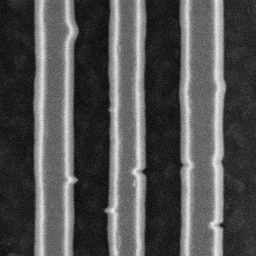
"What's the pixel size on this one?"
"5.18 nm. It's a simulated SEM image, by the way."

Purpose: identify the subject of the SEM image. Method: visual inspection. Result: one or a few lines or trenches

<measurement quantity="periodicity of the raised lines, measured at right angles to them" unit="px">73.8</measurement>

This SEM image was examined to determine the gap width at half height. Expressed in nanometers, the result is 229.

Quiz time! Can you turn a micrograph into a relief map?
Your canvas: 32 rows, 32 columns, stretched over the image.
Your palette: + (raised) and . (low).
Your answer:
.....++++.....++++.....++++.....
.....++++.....++++.....++++.....
.....++++.....++++.....++++.....
.....++++.....++++.....++++.....
.....++++.....++++.....++++.....
.....++++.....++++.....++++.....
.....++++.....++++.....++++.....
.....++++.....++++.....++++.....
.....++++.....++++.....++++.....
.....++++.....++++.....++++.....
.....++++.....+++......+++++....
.....++++.....++++.....+++++....
.....++++.....++++.....++++.....
.....++++.....++++.....++++.....
.....++++.....++++.....++++.....
.....++++.....++++.....++++.....
.....++++.....++++.....++++.....
.....++++.....++++.....++++.....
.....++++.....++++.....++++.....
.....++++.....++++.....++++.....
.....++++.....++++.....++++.....
.....++++.....+++......++++.....
.....++++.....++++.....++++.....
.....++++.....++++.....++++.....
.....++++.....++++.....++++.....
.....++++.....++++.....++++.....
.....++++.....++++.....++++.....
.....++++.....++++.....++++.....
.....++++.....++++.....++++.....
.....++++.....++++.....++++.....
.....++++.....++++.....++++.....
.....++++.....++++.....++++.....